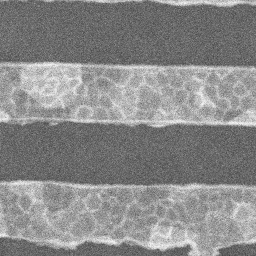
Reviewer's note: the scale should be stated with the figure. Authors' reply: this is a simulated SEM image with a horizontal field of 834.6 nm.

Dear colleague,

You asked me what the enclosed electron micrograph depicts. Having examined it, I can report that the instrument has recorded one or a few lines or trenches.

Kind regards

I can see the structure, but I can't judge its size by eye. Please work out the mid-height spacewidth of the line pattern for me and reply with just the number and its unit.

212 nanometres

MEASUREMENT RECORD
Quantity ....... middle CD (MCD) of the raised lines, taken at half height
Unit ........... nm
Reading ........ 180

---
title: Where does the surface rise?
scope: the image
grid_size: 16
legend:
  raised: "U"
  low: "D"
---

DDDDDDDDDDDDDDDD
DDDDDDDDDDDDDDDD
DDDDDDDDDDDDDDDD
DDDDDDDDDDDDDDDD
UUUUUUUUUUUUUUUU
UUUUUUUUUUUUUUUU
UUUUUUUUUUUUUUUU
DDDDUUUUUUUUUUUU
DDDDDDDDDDDDDDDD
DDDDDDDDDDDDDDDD
DDDDDDDDDDDDDDDD
UUUUDDDDDDDDDDDD
UUUUUUUUUUUUUUUU
UUUUUUUUUUUUUUUU
UUUUUUUUUUUUUUUU
DDDDDDDDDDDDUUDD